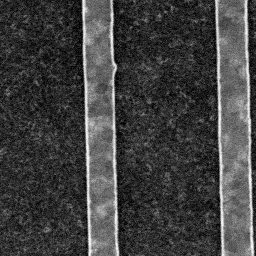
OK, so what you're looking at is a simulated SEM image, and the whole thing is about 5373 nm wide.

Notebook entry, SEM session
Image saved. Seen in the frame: one or a few lines or trenches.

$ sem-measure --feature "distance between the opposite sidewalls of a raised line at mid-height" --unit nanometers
593